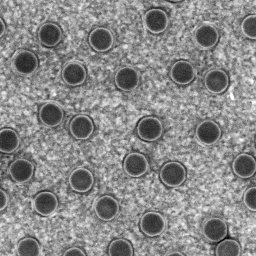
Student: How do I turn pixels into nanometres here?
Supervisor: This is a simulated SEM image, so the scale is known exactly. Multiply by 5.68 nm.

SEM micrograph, a regular array of raised bodies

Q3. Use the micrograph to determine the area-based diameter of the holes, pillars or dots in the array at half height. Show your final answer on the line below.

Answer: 133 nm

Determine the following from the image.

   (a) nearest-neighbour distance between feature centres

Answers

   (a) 220 nanometers